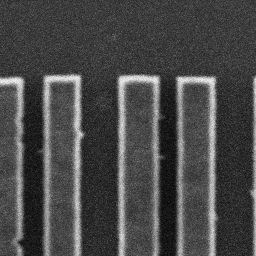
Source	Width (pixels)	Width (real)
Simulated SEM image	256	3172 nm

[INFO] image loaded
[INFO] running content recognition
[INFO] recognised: one or a few lines or trenches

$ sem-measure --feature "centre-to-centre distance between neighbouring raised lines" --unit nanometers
830